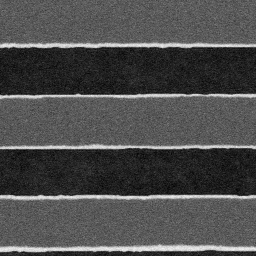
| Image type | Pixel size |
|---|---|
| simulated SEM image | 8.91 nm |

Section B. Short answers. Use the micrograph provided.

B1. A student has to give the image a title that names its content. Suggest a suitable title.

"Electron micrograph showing lines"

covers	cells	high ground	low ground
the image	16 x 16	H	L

HHHHHHHHHHHHHHHH
HHHHHHHHHHHHHHHH
HHHHHHHHHHHHHHHH
LLLLLLLLLLLLLLLL
LLLLLLLLLLLLLLLL
LLLLLLLLLLLLLLLL
HHHHHHHHHHHHHHHH
HHHHHHHHHHHHHHHH
HHHHHHHHHHHHHHHH
LLLLLLLLLLLLLLLL
LLLLLLLLLLLLLLLL
LLLLLLLLLLLLLLLL
HHHHHHHHHHHHHHHH
HHHHHHHHHHHHHHHH
HHHHHHHHHHHHHHHH
HHHHHHHHHHHHHHHH